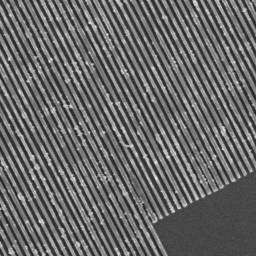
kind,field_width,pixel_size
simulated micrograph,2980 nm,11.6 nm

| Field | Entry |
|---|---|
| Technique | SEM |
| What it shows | parallel lines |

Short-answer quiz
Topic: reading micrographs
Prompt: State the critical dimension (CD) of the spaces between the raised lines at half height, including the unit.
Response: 0.035 microns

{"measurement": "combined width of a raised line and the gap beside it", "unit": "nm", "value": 78.7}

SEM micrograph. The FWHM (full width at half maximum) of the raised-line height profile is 35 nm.